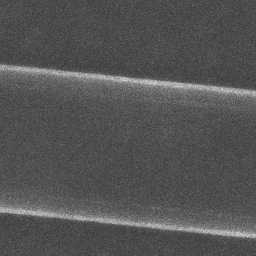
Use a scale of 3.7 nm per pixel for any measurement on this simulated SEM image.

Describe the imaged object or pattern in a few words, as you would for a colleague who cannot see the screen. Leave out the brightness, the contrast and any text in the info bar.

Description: one or a few lines or trenches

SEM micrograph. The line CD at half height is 527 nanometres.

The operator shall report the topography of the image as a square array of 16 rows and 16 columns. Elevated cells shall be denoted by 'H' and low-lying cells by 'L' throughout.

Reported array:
LLLLLLLLLLLLLLLL
LLLLLLLLLLLLLLLL
LLLLLLLLLLLLLLLL
LLLLLLLLLLLLLLLL
HHHLLLLLLLLLLLLL
HHHHHHHHHHHHHLLL
HHHHHHHHHHHHHHHH
HHHHHHHHHHHHHHHH
HHHHHHHHHHHHHHHH
HHHHHHHHHHHHHHHH
HHHHHHHHHHHHHHHH
HHHHHHHHHHHHHHHH
HHHHHHHHHHHHHHHH
LLLLHHHHHHHHHHHH
LLLLLLLLLLLLLHHH
LLLLLLLLLLLLLLLL